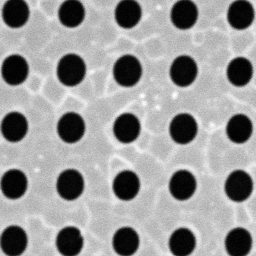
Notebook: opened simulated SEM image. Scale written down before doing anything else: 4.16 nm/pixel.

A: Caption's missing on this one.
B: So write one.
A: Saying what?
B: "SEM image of a regular array of holes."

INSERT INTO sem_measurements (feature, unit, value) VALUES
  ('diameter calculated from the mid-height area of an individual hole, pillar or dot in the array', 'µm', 0.122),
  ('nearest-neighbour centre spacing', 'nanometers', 233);